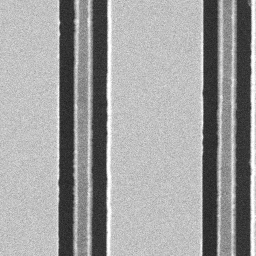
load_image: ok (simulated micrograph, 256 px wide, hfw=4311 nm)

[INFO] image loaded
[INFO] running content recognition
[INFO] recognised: lines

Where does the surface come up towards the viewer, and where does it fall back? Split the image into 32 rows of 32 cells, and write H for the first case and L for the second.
HHHHHHHLLLHLLHHHHHHHHHHHHLLHHLLH
HHHHHHHLLLHLLHHHHHHHHHHHHLLHHLLH
HHHHHHHLLLHLLHHHHHHHHHHHHLLHHLLH
HHHHHHHLLLHLLHHHHHHHHHHHHLLHHLLH
HHHHHHHLLHHLLHHHHHHHHHHHHLLHHLLH
HHHHHHHLLLHLLHHHHHHHHHHHHLLHHLLH
HHHHHHHLLHHLLHHHHHHHHHHHHLLHHLLH
HHHHHHHLLLHLLHHHHHHHHHHHHLLHHLLH
HHHHHHHLLHHLLHHHHHHHHHHHHLLHHLLH
HHHHHHHLLHHLLHHHHHHHHHHHHLLHHLLH
HHHHHHHLLHHLLHHHHHHHHHHHHLLHHLLH
HHHHHHHLLHHLLHHHHHHHHHHHHLLHHLLH
HHHHHHHLLHHLLHHHHHHHHHHHHLLHHLLH
HHHHHHHLLHHLLHHHHHHHHHHHHLLHHLLH
HHHHHHHLLHHLLHHHHHHHHHHHHLLHHLLH
HHHHHHHLLHHLLHHHHHHHHHHHHLLHHLLH
HHHHHHHLLHHLLHHHHHHHHHHHHLLHHLLH
HHHHHHHLLHHLLHHHHHHHHHHHHLLHHLLH
HHHHHHHLLHHLLHHHHHHHHHHHHLLHHLLH
HHHHHHHLLHHLLHHHHHHHHHHHHLLHHLLH
HHHHHHHLLHHLLHHHHHHHHHHHHLLHHLLH
HHHHHHHLLHHLLHHHHHHHHHHHHLLHHLLH
HHHHHHHLLHHLLHHHHHHHHHHHHLLHHLLH
HHHHHHHLLHHLLHHHHHHHHHHHHLLHHLLH
HHHHHHHLLHHLLHHHHHHHHHHHHLLHHLLH
HHHHHHHLLHHLLHHHHHHHHHHHHLLHHLLH
HHHHHHHLLHHLLHHHHHHHHHHHHLLHHLLH
HHHHHHHLLHHLLHHHHHHHHHHHHLLHHLLH
HHHHHHHLLHHLLHHHHHHHHHHHHLLHHLLH
HHHHHHHLLHHLLHHHHHHHHHHHHLLHHLLH
HHHHHHHLLHHLLHHHHHHHHHHHHLLHHLLH
HHHHHHHLLHHLLHHHHHHHHHHHHLLHHLLH